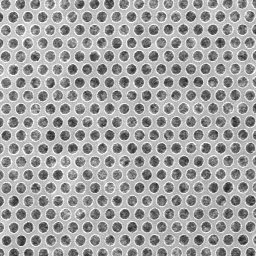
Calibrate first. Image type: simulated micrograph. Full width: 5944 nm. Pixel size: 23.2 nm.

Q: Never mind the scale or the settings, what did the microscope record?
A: a regular array of holes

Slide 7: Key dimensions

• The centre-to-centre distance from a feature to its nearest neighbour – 341 nm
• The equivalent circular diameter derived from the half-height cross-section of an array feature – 0.254 µm